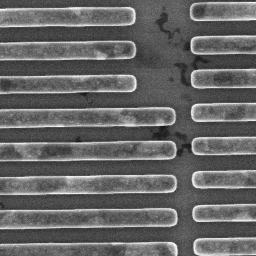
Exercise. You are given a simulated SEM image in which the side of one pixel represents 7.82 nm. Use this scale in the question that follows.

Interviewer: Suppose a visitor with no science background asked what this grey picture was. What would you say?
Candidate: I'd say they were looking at wiring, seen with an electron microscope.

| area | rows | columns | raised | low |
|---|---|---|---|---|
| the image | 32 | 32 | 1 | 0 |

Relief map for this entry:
00000000000000000000000011111111
11111111111111111000000011111111
11111111111111111000000000000000
00000000000000000000000000000000
00000000000000000000000000000000
11111111111111111000000011111111
11111111111111111000000011111111
00000000000000000000000000000000
00000000000000000000000000000000
00000000000011110000000011111111
11111111111111111000000011111111
11111111110000000000000000000000
00000000000000000000000000000000
00000000000000000000000011111111
11111111111111111111110011111111
11111111111111111111100000000000
00000000000000000000000000000000
00000000000000000000000011111111
11111111111111111111110011111111
11111111111111111111110000000000
00000000000000000000000000000000
00000000000000000000000001111111
11111111111111111111110011111111
11111111111111111111110001001100
00000000000000000000000000000000
00000000000000000000000000000000
11111111111111111111110011111111
11111111111111111111110001111111
11100000000000000000000000000000
00000000000000000000000000000000
00000010011111111111110011111111
11111111111111111111110011111111